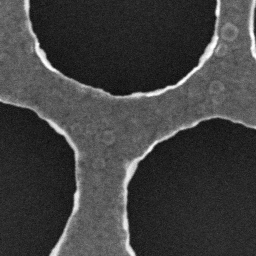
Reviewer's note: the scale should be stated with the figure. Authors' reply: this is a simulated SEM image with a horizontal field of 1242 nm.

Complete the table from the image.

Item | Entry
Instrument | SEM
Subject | holes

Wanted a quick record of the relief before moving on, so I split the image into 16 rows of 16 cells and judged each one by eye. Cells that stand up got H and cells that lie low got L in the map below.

HHLLLLLLLLLLLLHH
HHLLLLLLLLLLLLHH
HHLLLLLLLLLLLHHH
HHHLLLLLLLLLLHHH
HHHHLLLLLLLLHHHH
HHHHHHLLLLHHHHHH
LHHHHHHHHHHHHHHH
LLLHHHHHHHHHHLHH
LLLLHHHHHHHLLLLL
LLLLLHHHHLLLLLLL
LLLLLHHHLLLLLLLL
LLLLLHHHLLLLLLLL
LLLLLHHHLLLLLLLL
LLLLHHHHLLLLLLLL
LLLLHHHHLLLLLLLL
LLLLHHHHLLLLLLLL